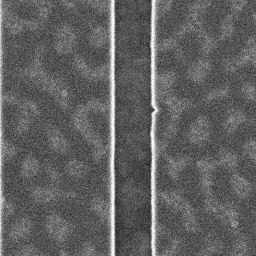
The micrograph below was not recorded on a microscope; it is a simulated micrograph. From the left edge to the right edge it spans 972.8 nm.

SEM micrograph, one or a few lines or trenches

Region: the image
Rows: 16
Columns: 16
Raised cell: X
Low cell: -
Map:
XXXXXXX---XXXXXX
XXXXXXX---XXXXXX
XXXXXXX---XXXXXX
XXXXXXX---XXXXXX
XXXXXXX---XXXXXX
XXXXXXX---XXXXXX
XXXXXXX---XXXXXX
XXXXXXX---XXXXXX
XXXXXXX---XXXXXX
XXXXXXX---XXXXXX
XXXXXXX---XXXXXX
XXXXXXX---XXXXXX
XXXXXXX---XXXXXX
XXXXXXX---XXXXXX
XXXXXXX---XXXXXX
XXXXXXX---XXXXXX